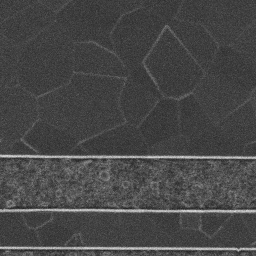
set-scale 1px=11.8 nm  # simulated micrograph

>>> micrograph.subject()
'one or a few lines or trenches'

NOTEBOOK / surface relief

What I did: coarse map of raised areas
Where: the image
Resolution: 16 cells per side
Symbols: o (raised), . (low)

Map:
oooooooooooooooo
oooooooooooooooo
oooooooooooooooo
oooooooooooooooo
oooooooooooooooo
oooooooooooooooo
oooooooooooooooo
oooooooooooooooo
oooooooooooooooo
oooooooooooooooo
................
................
................
oooooooooooooooo
oooooooooooooooo
.........ooooooo